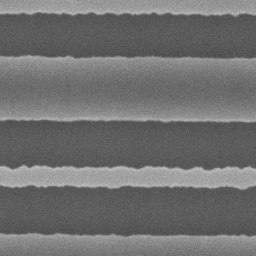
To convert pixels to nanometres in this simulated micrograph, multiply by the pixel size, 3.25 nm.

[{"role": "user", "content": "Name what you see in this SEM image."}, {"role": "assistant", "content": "lines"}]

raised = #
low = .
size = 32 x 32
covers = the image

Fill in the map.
################################
################################
................................
................................
................................
................................
................................
################################
################################
################################
################################
################################
################################
################################
################################
................................
................................
................................
................................
................................
................................
################################
################################
..............#...........#...#.
................................
................................
................................
................................
................................
###############.###...##...##.#.
################################
################################